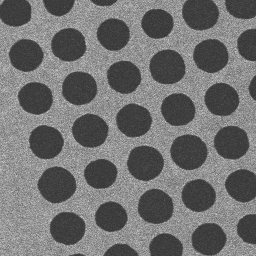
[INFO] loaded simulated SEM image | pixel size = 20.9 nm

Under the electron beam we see a regular array of holes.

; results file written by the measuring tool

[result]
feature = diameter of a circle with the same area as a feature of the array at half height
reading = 0.722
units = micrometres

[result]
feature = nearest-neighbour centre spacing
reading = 921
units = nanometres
